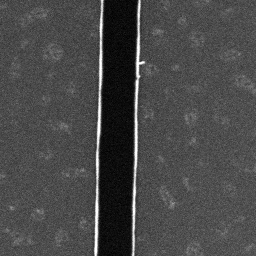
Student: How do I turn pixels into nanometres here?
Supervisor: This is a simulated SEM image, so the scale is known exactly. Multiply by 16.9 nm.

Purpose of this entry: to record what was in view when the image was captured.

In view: one or a few lines or trenches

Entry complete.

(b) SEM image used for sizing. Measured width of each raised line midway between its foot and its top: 634 nanometres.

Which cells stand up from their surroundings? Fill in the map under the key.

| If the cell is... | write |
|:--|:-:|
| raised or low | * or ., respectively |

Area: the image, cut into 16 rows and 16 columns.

......***.......
......***.......
......***.......
......***.......
......***.......
......***.......
......***.......
......***.......
......***.......
......***.......
......**........
......**........
......**........
......**........
......**........
......**........